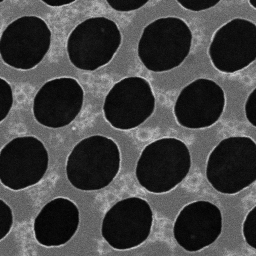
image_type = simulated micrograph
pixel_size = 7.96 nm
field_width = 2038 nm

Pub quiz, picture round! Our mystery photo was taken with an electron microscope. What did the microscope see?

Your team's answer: a regular array of holes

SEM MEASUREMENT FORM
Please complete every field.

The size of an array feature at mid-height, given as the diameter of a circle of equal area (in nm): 406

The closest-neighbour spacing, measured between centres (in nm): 550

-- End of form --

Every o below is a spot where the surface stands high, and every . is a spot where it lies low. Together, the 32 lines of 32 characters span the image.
oooooo...ooooo....ooooo....oooo.
oooooooooooooooooooooooooooooooo
oo...oooooo...oooooo...oooooo..o
o.....ooo......ooo......oooo....
......ooo......ooo......ooo.....
......oo.......oo.......oo......
......oo......ooo.......oo......
.....oooo.....oooo.....ooo......
oo..oooooo..oooooo....ooooo...oo
oooooooooooooooooooooooooooooooo
.ooooo....ooooo....ooooo...ooooo
..ooo.....oooo.....oooo.....oooo
..oo......ooo......ooo......ooo.
.ooo......ooo......ooo......ooo.
.ooo......ooo......ooo.....oooo.
ooooo....ooooo....ooooo....ooooo
oooooooooooooooooooooooooooooooo
oo...ooooo....oooooo..oooooo...o
......ooo......ooo.....oooo.....
......ooo......ooo......oo......
......oo.......oo.......oo......
......oo.......oo.......oo......
.....oooo.....ooo......ooo......
o..ooooooo...ooooo....ooooo....o
oooooooooooooooooooooooooooooooo
.ooooo...ooooo.....ooooo...ooooo
.oooo.....ooo......oooo.....ooo.
..oo......ooo......ooo......ooo.
.ooo......ooo......ooo......oo..
.ooo.....oooo......ooo.....oooo.
ooooo...oooooo...ooooo....ooooo.
oooooooooooooooooooooooooooooooo